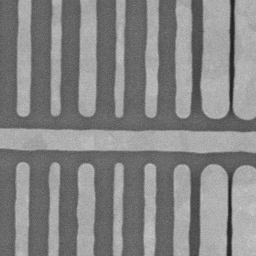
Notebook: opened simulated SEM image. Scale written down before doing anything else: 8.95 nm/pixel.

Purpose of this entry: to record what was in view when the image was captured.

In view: groups of lines, slits or small figures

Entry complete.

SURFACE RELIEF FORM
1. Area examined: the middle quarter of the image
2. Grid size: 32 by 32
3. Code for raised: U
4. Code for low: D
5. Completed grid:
DDDDUUUUDDDDDUUDDDDDUUUUDDDDUUUU
DDDDUUUUDDDDDUUDDDDDDUUDDDDDUUUU
DDDDUUUUDDDDDUUDDDDDDUUDDDDDUUUU
DDDDUUUUDDDDDUUDDDDDDUUDDDDDUUUU
DDDDUUUUDDDDDUUDDDDDDUUDDDDDUUUU
DDDDUUUUDDDDDUUDDDDDDUUDDDDDUUUU
DDDDUUUUDDDDDUUDDDDDUUUDDDDDUUUU
DDDDUUUUDDDDDUUDDDDDUUUDDDDDUUUU
DDDDUUUUDDDDDUUDDDDDUUUDDDDDUUUU
DDDDUUUUDDDDDUUDDDDDUUUDDDDDUUUU
DDDDUUUUDDDDDUUDDDDDUUUDDDDDUUUU
DDDDUUUUDDDDDUUDDDDDUUUDDDDDUUUD
DDDDUUUDDDDDDUUDDDDDUUUDDDDDUUUD
DDDDDDDDDDDDDDDDDDDDDDDDDDDDDDDD
DDDDDDDDDDDDDDDDDDDDDDDDDDDDDDDD
DDDDDDDDDDDDDDDDDDDDDDDDDDDDDDDD
DDDDDDDDDDDDDDDDDDDDDDDDDDDDDDDD
UUUUUUUUUUUUUUUUUUUUUUUUUUUUUUUU
UUUUUUUUUUUUUUUUUUUUUUUUUUUUUUUU
UUUUUUUUUUUUUUUUUUUUUUUUUUUUUUUU
UUUUUUUUUUUUUUUUUUUUUUUUUUUUUUUU
DDDDDDDDDDDDDDDDDUDDDDDDUUUUUUUU
DDDDDDDDDDDDDDDDDDDDDDDDDDDDDDDD
DDDDDDDDDDDDDDDDDDDDDDDDDDDDDDDD
DDDDDDDDDDDDDDDDDDDDDDDDDDDDDDDD
DDDDUUUDDDDDDUUDDDDDUUUDDDDDDUDD
DDDDUUUDDDDDDUUDDDDDUUUDDDDDUUUD
DDDDUUUDDDDDDUUDDDDDUUUDDDDDUUUD
DDDDUUUDDDDDDUUDDDDDUUUDDDDDUUUD
DDDDUUUDDDDDDUUDDDDDUUUDDDDDUUUD
DDDDUUUDDDDDDUUDDDDDUUUDDDDDUUUU
DDDDUUUDDDDDDUUDDDDDUUUDDDDDUUUU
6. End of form